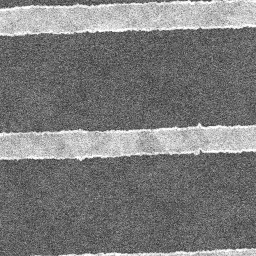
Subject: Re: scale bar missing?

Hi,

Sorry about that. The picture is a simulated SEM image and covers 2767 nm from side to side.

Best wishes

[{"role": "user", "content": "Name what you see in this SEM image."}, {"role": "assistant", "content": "one or a few lines or trenches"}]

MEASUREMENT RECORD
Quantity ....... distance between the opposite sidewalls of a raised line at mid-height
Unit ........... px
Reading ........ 26.6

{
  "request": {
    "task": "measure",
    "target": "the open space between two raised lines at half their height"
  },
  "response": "1060 nanometres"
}